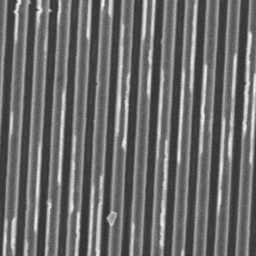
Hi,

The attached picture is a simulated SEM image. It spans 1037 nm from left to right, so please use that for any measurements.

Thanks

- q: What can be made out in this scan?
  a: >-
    parallel lines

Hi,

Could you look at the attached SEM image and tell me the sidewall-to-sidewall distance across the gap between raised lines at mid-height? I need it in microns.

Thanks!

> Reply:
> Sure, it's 0.0389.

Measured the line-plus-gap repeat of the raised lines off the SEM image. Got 85.7 nanometers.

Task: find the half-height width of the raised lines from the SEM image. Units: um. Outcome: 0.0495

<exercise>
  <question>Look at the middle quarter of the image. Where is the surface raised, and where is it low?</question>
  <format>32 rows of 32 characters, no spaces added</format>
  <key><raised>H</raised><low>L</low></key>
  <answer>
HLLHHHLLLHHLLLHHHLLHHHLLHHHLLLHH
LLLHHHLLLHHLLLHHHLLHHHLLHHHLLLHH
HLLHHHLLHHHLLLHHLLLHHHLLHHHLLLHH
HLLHHHLLHHHLLLHHLLLHHHLLHHHLLLHH
HLLHHHLLHHHLLLHHLLLHHHLLHHHLLLHH
LLLHHHLLHHHLLLHHLLLHHHLLHHHLLHHH
LLLHHHLLHHHLLLHHLLLHHHLLHHHLLHHH
LLLHHHLLHHHLLLHHLLLHHLLLHHHLLHHH
LLLHHHLLHHHLLHHHLLLHHLLLHHHLLHHH
LLLHHHLLHHHLLHHHLLLHHLLLHHHLLHHH
LLLHHHLLHHHLLHHHLLHHHLLLHHHLLHHH
LLLHHLLLHHHLLHHHLLHHHLLLHHHLLHHH
LLLHHLLLHHHLLHHHLLLHHLLLHHLLLHHH
LLLHHLLLHHHLLHHHLLLHHLLLHHLLLHHH
LLHHHLLLHHHLLHHHLLHHHLLLHHLLLHHH
LLHHHLLLHHHLLHHHLLHHHLLLHHLLLHHH
LLLHHLLLHHLLLHHHLLHHHLLLHHLLLHHH
LLHHHLLLHHLLLHHHLLHHHLLLHHLLLHHL
LLHHHLLHHHLLLHHHLLHHHLLLHHLLLHHL
LLHHHLLHHHLLLHHHLLHHHLLHHHLLLHHL
LLHHHLLHHHLLLHHHLLHHHLLHHHLLLHHL
LLHHHLLHHHLLLHHLLLHHHLLHHHLLLHHL
LLHHHLLHHHLLLHHLLLHHHLLHHHLLLHHL
LLHHHLLHHHLLLHHLLLHHHLLHHHLLLHHL
LLHHHLLHHHLLHHHLLLHHHLLHHHLLHHHL
LLHHHLLHHHLLHHHLLLHHHLLHHHLLHHHL
LLHHHLLHHHLLHHHLLLHHLLLHHHLLHHHL
LLHHHLLHHHLLHHHLLLHHLLLHHHLLHHHL
LLHHHLLHHHLLHHHLLLHHLLLHHHLLHHHL
LLHHLLLHHHLLHHHLLLHHLLLHHHLLHHHL
LLHHLLLHHHLLHHHLLLHHLLLHHHLLHHHL
LLHHLLLHHHLLHHHLLLHHLLLHHLLLHHHL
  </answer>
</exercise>